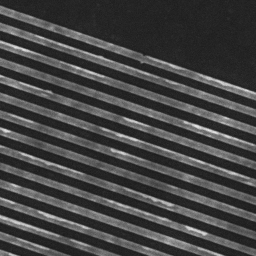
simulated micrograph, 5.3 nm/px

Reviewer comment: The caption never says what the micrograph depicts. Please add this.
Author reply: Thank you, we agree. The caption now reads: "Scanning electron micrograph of parallel lines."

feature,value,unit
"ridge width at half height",40.2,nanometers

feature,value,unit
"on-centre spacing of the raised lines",87.3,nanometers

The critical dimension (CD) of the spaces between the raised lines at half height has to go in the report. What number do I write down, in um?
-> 0.049